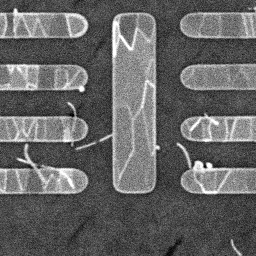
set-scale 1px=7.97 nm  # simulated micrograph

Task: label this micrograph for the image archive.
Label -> groups of lines, slits or small figures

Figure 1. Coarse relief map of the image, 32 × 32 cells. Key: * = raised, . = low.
................................
................................
***********...*****....*********
***********...*****....*********
**********....*****.....********
..............*****.............
..............*****.............
..............*****.............
**********....*****....*********
***********...*****....*********
***********...*****....*********
..............*****.............
..............*****.............
..............*****.............
..............*****.............
***********...*****....**.******
***********...*****....**.******
**********....*****........*.***
..............*****.............
..............*****.............
..............*****.....*.......
**********....*****....**...****
***********...*****....**...****
***********....****....**..*****
................................
................................
................................
................................
................................
................................
................................
................................